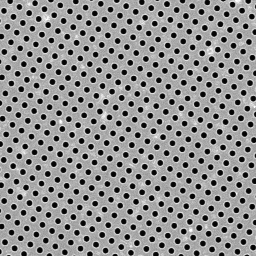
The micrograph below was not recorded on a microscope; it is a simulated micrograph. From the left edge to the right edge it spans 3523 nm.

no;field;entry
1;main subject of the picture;a regular array of holes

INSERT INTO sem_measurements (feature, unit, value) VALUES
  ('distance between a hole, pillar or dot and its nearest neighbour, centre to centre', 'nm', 152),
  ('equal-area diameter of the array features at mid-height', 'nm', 77.6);